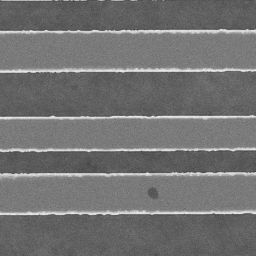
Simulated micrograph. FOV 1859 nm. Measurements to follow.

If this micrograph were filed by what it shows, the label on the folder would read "lines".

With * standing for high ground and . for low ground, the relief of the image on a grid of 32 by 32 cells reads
................................
................................
................................
................................
********************************
********************************
********************************
********************************
********************************
................................
................................
................................
................................
................................
................................
********************************
********************************
********************************
********************************
................................
................................
................................
********************************
********************************
********************************
********************************
********************************
................................
................................
................................
................................
................................